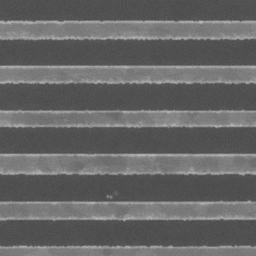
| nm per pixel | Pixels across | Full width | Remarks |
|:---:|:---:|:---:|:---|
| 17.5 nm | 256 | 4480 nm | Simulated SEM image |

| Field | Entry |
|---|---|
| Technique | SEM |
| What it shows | lines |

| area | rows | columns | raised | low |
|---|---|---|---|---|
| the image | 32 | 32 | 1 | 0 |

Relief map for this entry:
00000000000000000000000000000000
00000000000000000000000000000000
00000000000000000000000000000000
11111111111111111111111111111111
11111111111111111111111111111111
00000000000000000000000000000000
00000000000000000000000000000000
00000000000000000000000000000000
11111111111111111111111111111111
11111111111111111111111111111111
00000000000000000000000000000000
00000000000000000000000000000000
00000000000000000000000000000000
00000000000000000000000000000000
11111111111111111111111111111111
11111111111111111111111111111111
00000000000000000000000000000000
00000000000000000000000000000000
00000000000000000000000000000000
11111111111111111111111111111111
11111111111111111111111111111111
11111111111111111111111111111111
00000000000000000000000000000000
00000000000000000000000000000000
00000000000000000000000000000000
11111111111111111111111111111111
11111111111111111111111111111111
00000000000000000000000000000000
00000000000000000000000000000000
00000000000000000000000000000000
00000000000000000000000000000000
11111111111111111111111111111111